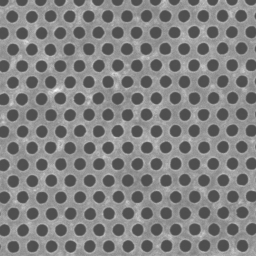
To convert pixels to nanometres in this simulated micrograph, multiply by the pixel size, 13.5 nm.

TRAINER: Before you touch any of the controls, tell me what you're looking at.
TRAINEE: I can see a regular array of holes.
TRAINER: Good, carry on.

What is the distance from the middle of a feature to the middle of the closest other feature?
251 nm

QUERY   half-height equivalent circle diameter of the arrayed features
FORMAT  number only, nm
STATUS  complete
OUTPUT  165